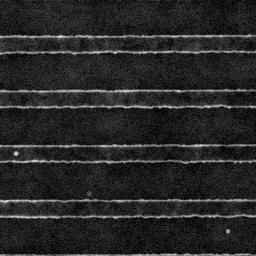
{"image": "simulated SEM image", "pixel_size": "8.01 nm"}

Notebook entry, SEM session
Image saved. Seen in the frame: lines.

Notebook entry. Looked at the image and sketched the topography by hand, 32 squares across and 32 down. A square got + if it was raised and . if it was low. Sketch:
................................
................................
................................
................................
...............................+
++++++++++++++++++++++++++++++++
++++++++++++++++++++++++++++++++
................................
................................
................................
................................
++++++++++++++++++++++++++++++++
++++++++++++++++++++++++++++++++
................................
................................
................................
................................
................................
++++++++++++++++++++++++++++++++
++++++++++++++++++++++++++++++++
................................
................................
................................
................................
................................
++++++++++++++++++++++++++++++++
++++++++++++++++++++++++++++++++
................................
................................
................................
................................
................................